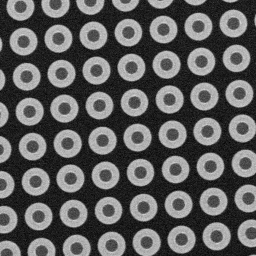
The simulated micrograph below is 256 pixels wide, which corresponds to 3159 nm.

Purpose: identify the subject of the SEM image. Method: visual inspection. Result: an array of small figures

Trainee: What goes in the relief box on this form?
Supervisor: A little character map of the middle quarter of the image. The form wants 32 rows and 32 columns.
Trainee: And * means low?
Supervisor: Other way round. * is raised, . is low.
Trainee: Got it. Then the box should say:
**...******..*******..*******..*
***..******..*******..*******...
***..******...******...*****....
***..******....****......**.....
**....****......................
*.........................*.....
................***.....*****...
.......****....*****...*******..
**....******..*******..*******..
***...******..*******..*******..
***...******..*******..******...
***...******...*****....*****...
***...******....***.............
***.....**......................
*.........................***...
.................***....******..
........****....*****...******..
***....******..*******..*******.
****..*******..*******..******..
****..*******..*******..******..
****..*******...*****....****...
****...*****.....***............
***......*......................
..........................****..
.................****....******.
***.....*****...******...******.
****...******...******...******.
*****..*******..******...******.
*****..*******..******...*****..
*****..******....*****.....**...
****....*****...................
****............................